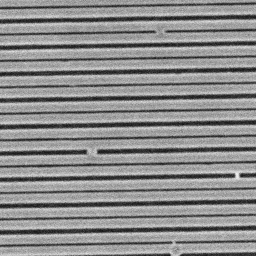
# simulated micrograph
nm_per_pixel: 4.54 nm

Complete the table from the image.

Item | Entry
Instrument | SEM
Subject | parallel lines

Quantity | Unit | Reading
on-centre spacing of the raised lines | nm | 60.1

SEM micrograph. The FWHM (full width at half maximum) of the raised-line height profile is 43.7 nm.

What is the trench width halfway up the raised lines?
19.9 nm